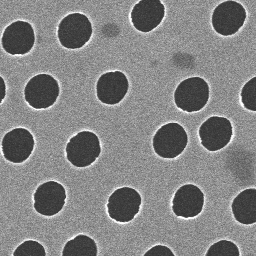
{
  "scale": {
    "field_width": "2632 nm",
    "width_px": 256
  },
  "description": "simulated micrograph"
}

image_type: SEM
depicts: a regular array of holes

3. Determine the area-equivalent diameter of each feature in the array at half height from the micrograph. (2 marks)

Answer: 349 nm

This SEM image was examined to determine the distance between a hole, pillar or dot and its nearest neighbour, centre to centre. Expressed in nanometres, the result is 608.